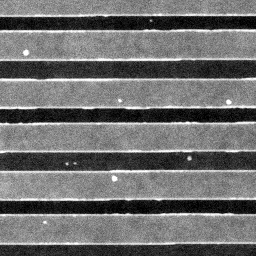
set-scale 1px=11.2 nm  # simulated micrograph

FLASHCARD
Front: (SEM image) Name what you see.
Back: lines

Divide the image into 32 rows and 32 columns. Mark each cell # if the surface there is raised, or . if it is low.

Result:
################################
################################
................................
................................
################################
################################
################################
#######################.........
................................
................................
################################
################################
################################
#####.....##...####.............
................................
#.##############################
################################
################################
################################
................................
................................
################################
################################
################################
################################
................................
................................
################################
################################
################################
................................
................................